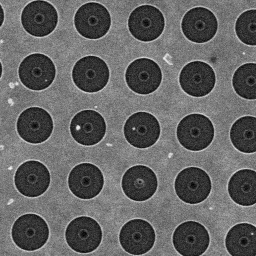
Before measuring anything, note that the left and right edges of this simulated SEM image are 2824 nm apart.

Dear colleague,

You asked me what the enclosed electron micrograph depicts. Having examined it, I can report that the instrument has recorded an array of small figures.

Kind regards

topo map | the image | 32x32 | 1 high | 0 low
11110011111001111111111111111111
11100001110000111000111000111100
11100001100000110000011000011100
11100001100000110000011000011000
11110011110001111000111000011100
11111111111111111111111111111110
11111111111111111111111111111111
11100011110001111001111111111111
11000001100000110000111000011100
11000001100000110000110000011000
11100011100001110000110000011000
11111111111011111001111000111000
11111111111111111111111111111111
11110111111111111111111111111111
11000011100001110001111000111111
11000001100001110000110000011000
11000001100001100000110000011000
11100011100001110000110000011000
11111111111111111011111000111000
11111111111111111111111111111111
11100111110011111111111111111111
11000011100001110001111000111000
11000011000001100000110000111000
11000011100001100000110000110000
11100111100011110001110000111000
11111111111111111111111111111100
11111111111111111111111111111111
11000011100011110011111111111111
10000011000001100001110000111000
10000011000001100001110000110000
11000011000001100001110000110000
11111111110111110011110000111000